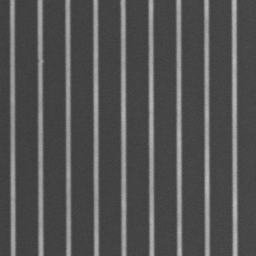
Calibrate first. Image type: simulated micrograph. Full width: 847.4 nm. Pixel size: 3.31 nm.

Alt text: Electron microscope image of parallel lines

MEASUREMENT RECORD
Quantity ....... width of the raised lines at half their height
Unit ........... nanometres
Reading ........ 12.8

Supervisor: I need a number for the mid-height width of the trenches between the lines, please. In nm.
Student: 77.4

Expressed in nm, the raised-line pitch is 91.9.